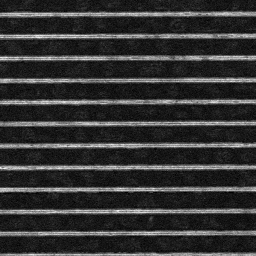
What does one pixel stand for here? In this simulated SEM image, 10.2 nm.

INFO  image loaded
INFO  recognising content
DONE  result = parallel lines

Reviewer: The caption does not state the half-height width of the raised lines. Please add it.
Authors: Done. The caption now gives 40.7 nanometres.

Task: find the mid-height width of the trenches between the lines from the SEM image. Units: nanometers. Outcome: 182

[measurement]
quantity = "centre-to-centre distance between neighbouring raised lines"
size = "21.9 pixels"